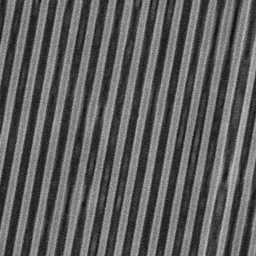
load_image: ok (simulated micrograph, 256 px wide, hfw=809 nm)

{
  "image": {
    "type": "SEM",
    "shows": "parallel lines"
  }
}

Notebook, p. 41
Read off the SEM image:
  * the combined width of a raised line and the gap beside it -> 16.6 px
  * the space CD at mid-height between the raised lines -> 30.3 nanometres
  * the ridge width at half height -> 22.1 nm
